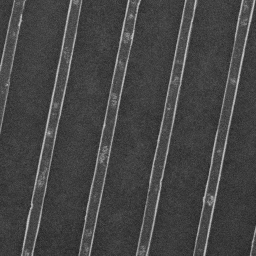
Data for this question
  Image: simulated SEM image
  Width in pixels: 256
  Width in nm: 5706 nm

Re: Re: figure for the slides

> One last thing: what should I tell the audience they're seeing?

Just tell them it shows parallel lines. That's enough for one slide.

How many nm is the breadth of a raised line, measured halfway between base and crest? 246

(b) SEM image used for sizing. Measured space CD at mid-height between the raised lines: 1010 nm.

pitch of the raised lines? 1.25 micrometres